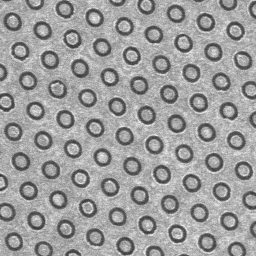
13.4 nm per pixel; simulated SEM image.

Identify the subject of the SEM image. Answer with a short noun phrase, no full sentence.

a regular array of ring-shaped grooves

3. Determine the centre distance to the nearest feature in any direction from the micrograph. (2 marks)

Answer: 407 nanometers